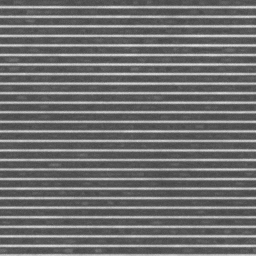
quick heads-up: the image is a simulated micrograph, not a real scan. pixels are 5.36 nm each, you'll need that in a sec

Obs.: parallel lines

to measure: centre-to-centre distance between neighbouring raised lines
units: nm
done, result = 51.2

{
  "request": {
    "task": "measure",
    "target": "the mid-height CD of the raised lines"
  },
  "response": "9.4 nanometers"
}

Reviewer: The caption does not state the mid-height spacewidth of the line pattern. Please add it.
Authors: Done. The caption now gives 41.5 nanometres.